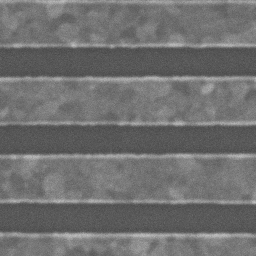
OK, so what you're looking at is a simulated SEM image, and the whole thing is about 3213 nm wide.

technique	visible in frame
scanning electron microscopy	lines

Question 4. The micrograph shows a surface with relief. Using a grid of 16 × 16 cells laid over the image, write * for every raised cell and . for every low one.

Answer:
****************
****************
****************
................
................
****************
****************
****************
................
................
****************
****************
****************
................
................
****************